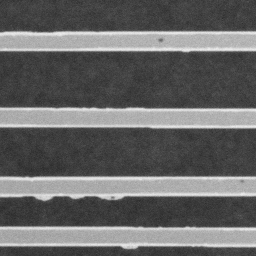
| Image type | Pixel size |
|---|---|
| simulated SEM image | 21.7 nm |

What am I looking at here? lines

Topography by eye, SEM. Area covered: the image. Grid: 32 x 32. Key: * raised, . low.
................................
................................
................................
................................
********************************
********************************
................................
................................
................................
................................
................................
................................
................................
................................
********************************
********************************
................................
................................
................................
................................
................................
................................
********************************
********************************
................................
................................
................................
................................
********.**...**................
********************************
********************************
................................